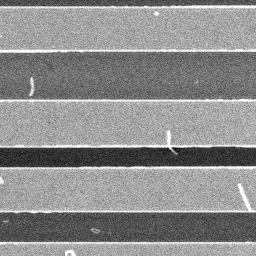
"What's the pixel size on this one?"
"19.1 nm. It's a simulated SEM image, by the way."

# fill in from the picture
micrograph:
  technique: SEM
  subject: lines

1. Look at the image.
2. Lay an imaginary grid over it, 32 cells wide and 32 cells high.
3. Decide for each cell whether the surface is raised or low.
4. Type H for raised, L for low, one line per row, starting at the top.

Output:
LLLLLLLLLLLLLLLLLLLLLLLLLLLLLLLL
HHHHHHHHHHHHHHHHHHHHHHHHHHHHHHHH
HHHHHHHHHHHHHHHHHHHHHHHHHHHHHHHH
HHHHHHHHHHHHHHHHHHHHHHHHHHHHHHHH
HHHHHHHHHHHHHHHHHHHHHHHHHHHHHHHH
HHHHHHHHHHHHHHHHHHHHHHHHHHHHHHHH
LLLLLLLLLLLLLLLLLLLLLLLLLLLLLLLL
LLLLLLLLLLLLLLLLLLLLLLLLLLLLLLLL
LLLLLLLLLLLLLLLLLLLLLLLLLLLLLLLL
LLLLLLLLLLLLLLLLLLLLLLLLLLLLLLLL
LLLLLLLLLLLLLLLLLLLLLLLLLLLLLLLL
LLLLLLLLLLLLLLLLLLLLLLLLLLLLLLLL
LLLLLLLLLLLLLLLLLLLLLLLLLLLLLLLL
HHHHHHHHHHHHHHHHHHHHHHHHHHHHHHHH
HHHHHHHHHHHHHHHHHHHHHHHHHHHHHHHH
HHHHHHHHHHHHHHHHHHHHHHHHHHHHHHHH
HHHHHHHHHHHHHHHHHHHHHHHHHHHHHHHH
HHHHHHHHHHHHHHHHHHHHHHHHHHHHHHHH
LLLLLLLLLLLLLLLLLLLLLLLLLLLLLLLL
LLLLLLLLLLLLLLLLLLLLLLLLLLLLLLLL
LLLLLLLLLLLLLLLLLLLLLLLLLLLLLLLL
HHHHHHHHHHHHHHHHHHHHHHHHHHHHHHHH
HHHHHHHHHHHHHHHHHHHHHHHHHHHHHHHH
HHHHHHHHHHHHHHHHHHHHHHHHHHHHHHHH
HHHHHHHHHHHHHHHHHHHHHHHHHHHHHHHH
HHHHHHHHHHHHHHHHHHHHHHHHHHHHHHHH
LLLLLLLLLLLLLLLLLLLLLLLLLLLLLLLL
LLLLLLLLLLLLLLLLLLLLLLLLLLLLLLLL
LLLLLLLLLLLLLLLLLLLLLLLLLLLLLLLL
LLLLLLLLLLLLLLLLLLLLLLLLLLLLLLLL
HHHHHHHHHHHHHHHHHHHHHHHHHHHHHHHH
HHHHHHHHHHHHHHHHHHHHHHHHHHHHHHHH